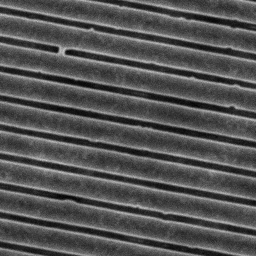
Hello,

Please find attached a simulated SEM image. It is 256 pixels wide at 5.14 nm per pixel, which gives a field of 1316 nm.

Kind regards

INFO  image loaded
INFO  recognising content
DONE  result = parallel lines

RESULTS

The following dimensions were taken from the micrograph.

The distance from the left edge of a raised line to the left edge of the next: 148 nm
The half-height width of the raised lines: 0.109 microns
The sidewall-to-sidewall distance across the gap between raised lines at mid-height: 0.0398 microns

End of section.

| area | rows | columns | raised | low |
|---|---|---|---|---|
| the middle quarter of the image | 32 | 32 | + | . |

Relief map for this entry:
+++++++++++++++...........++++++
++++++++++++++++++++............
++++++++++++++++++++++++++......
..++++++++++++++++++++++++++++++
.......+++++++++++++++++++++++++
++............++++++++++++++++++
++++++++...........+++++++++++++
+++++++++++++...........++++++++
+++++++++++++++++++...........++
++++++++++++++++++++++++........
.++++++++++++++++++++++++++++...
.......+++++++++++++++++++++++++
............++++++++++++++++++++
++++++...........+++++++++++++++
+++++++++++...........++++++++++
+++++++++++++++++...........++++
+++++++++++++++++++++++.........
+++++++++++++++++++++++++++.....
....++++++++++++++++++++++++++++
..........++++++++++++++++++++++
++++...........+++++++++++++++++
++++++++++...........+++++++++++
++++++++++++++++..........++++++
++++++++++++++++++++...........+
+++++++++++++++++++++++++.......
..+++++++++++++++++++++++++++++.
........++++++++++++++++++++++++
++...........+++++++++++++++++++
++++++++..........++++++++++++++
++++++++++++++..........++++++++
+++++++++++++++++++..........+++
+++++++++++++++++++++++.........